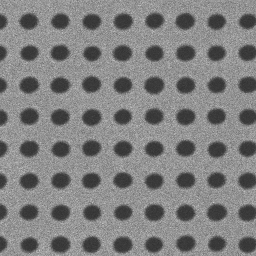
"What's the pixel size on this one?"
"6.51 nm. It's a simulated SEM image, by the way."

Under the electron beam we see a regular array of holes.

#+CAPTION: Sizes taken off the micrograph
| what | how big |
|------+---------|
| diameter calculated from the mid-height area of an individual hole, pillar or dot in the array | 0.115 microns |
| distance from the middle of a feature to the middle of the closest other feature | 202 nm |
